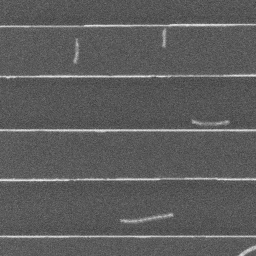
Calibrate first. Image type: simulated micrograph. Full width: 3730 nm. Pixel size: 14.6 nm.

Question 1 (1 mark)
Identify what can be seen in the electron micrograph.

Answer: lines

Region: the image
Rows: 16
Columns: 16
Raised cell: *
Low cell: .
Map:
................
................
****************
****************
****************
................
................
................
****************
****************
****************
................
................
................
................
****************